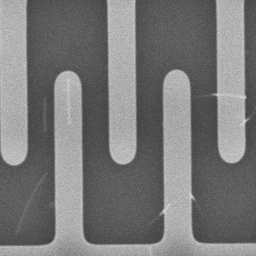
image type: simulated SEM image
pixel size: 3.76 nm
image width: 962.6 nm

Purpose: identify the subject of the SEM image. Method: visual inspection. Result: groups of lines, slits or small figures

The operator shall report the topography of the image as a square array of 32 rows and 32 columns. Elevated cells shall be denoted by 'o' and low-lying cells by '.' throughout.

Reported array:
ooo...........ooo..........ooo..
ooo...........ooo..........ooo..
ooo...........ooo..........ooo..
ooo...........ooo..........ooo..
ooo...........ooo..........ooo..
ooo...........ooo..........ooo..
ooo...........ooo..........ooo..
ooo...........ooo..........ooo..
ooo...........ooo..........ooo..
ooo....ooo....ooo....oo....ooo..
ooo....ooo....ooo....ooo...ooo..
ooo....ooo....ooo...oooo...ooo..
ooo....ooo....ooo...oooo...oooo.
ooo....ooo....ooo....ooo...ooo..
ooo....ooo....ooo....ooo...oooo.
ooo....ooo....ooo....ooo...oooo.
ooo....ooo....ooo....ooo...oooo.
ooo....ooo....ooo....ooo...oooo.
ooo....ooo....ooo....ooo...oooo.
ooo....ooo....ooo....ooo....oo..
.o.....ooo...........ooo........
.......ooo...........ooo........
.......ooo...........ooo........
.......ooo...........ooo........
.......ooo...........ooo........
.......ooo...........ooo........
.......ooo..........oooo........
.......ooo...........ooo........
.......ooo...........ooo........
.......ooo..........oooo........
......ooooo........ooooooo......
oooooooooooooooooooooooooooooooo